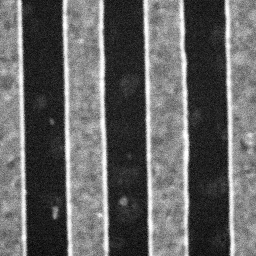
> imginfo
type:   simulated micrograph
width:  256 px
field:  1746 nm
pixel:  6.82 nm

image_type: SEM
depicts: one or a few lines or trenches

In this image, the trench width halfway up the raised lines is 297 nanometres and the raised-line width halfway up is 256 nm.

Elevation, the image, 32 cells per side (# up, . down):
##......#####.....#####.....####
##......#####.....#####.....####
##......#####.....#####.....####
##......#####.....#####......###
##......#####.....#####.....####
##......#####.....#####.....####
###.....#####.....#####.....####
###.....#####.....#####......###
###.....#####.....#####......###
###.....#####.....#####......###
###.....#####......####......###
###.....#####......####......###
###.....#####......####......###
###.....#####......####......###
###.....#####......####......###
###.....#####......####......###
###.....#####......####......###
###.....#####......####......###
###.....#####......####......###
###.....#####......####......###
###.....#####......####......###
###......####......####......###
###......####......####......###
###......####......####......###
###......####......####......###
###......####......####......###
###......####......####......###
###......####......####......###
###......####......####......###
###......####......####......###
###......####......####......###
###......####......####......###